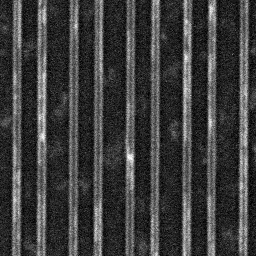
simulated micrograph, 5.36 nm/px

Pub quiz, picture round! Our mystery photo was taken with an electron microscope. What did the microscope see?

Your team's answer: parallel lines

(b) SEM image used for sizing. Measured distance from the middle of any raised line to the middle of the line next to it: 152 nm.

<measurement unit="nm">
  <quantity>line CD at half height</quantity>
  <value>32.1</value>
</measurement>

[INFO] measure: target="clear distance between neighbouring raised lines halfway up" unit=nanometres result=116